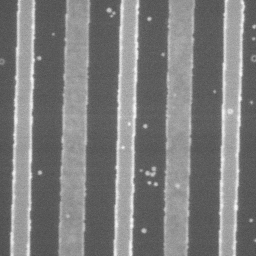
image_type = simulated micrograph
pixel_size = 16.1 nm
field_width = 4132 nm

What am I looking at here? lines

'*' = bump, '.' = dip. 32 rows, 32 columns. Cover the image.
..**....***....**....***....**..
..**....***....**....***....**..
..**....***....**....***....**..
..**....***....**....***....**..
..**....***....**....***....**..
..**....***....**....***....**..
..**....***....**....***....**..
..**....***....**....***....**..
..**....***....**....***....**..
..**....***....**....***....**..
..**....***....**....***....**..
..**....***....**....***....**..
..**....***....**....***....**..
..**....***....**....***....**..
..**....***....**....***....**..
..**....***....**....***....**..
..**....***....**....***....**..
..**....***....**....***....**..
..**....***....**....***....**..
..**....***....**....***....**..
..**....***....**....***....**..
..**....***....**....***....**..
..**....***....**....***....**..
..**....***....**....***....**..
..**....***....**....***....**..
..**....***...***....***....**..
..**....***...***....***....**..
..**...****...***....**.....*...
..**...****...***....**....**...
.***...***....**.....**....**...
.***...***....**.....**....**...
.***...***....**.....**....**...